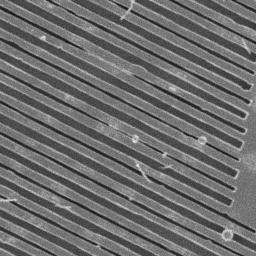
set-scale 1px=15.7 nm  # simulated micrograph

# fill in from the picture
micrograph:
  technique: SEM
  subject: parallel lines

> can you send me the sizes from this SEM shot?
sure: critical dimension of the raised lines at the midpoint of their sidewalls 136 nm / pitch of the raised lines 219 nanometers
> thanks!